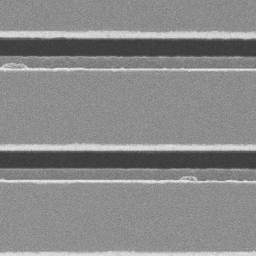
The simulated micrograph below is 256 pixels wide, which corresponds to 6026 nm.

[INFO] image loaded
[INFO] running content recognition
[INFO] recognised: lines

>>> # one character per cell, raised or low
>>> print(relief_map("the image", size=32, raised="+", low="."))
++++++++++++++++++++++++++++++++
++++++++++++++++++++++++++++++++
++++++++++++++++++++++++++++++++
++++++++++++++++++++++++++++++++
++++++++++++++++++++++++++++++++
................................
................................
++++++++++++++++++++++++++++++++
++++++++++++++++++++++++++++++++
++++++++++++++++++++++++++++++++
++++++++++++++++++++++++++++++++
++++++++++++++++++++++++++++++++
++++++++++++++++++++++++++++++++
++++++++++++++++++++++++++++++++
++++++++++++++++++++++++++++++++
++++++++++++++++++++++++++++++++
++++++++++++++++++++++++++++++++
++++++++++++++++++++++++++++++++
++++++++++++++++++++++++++++++++
................................
................................
++++++++++++++++++++++++++++++++
++++++++++++++++++++++++++++++++
++++++++++++++++++++++++++++++++
++++++++++++++++++++++++++++++++
++++++++++++++++++++++++++++++++
++++++++++++++++++++++++++++++++
++++++++++++++++++++++++++++++++
++++++++++++++++++++++++++++++++
++++++++++++++++++++++++++++++++
++++++++++++++++++++++++++++++++
++++++++++++++++++++++++++++++++